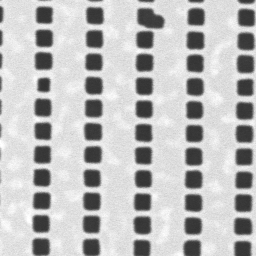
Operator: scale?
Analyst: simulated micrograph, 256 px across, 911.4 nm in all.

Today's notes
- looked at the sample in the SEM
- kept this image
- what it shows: a regular array of holes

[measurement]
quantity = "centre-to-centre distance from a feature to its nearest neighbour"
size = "81.7 nm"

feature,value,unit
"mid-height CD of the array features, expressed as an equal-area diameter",69.2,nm